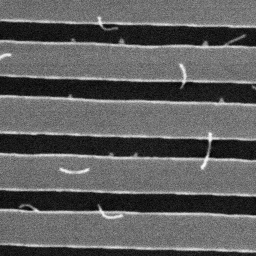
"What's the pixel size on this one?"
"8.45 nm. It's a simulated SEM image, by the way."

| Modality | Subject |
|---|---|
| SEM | lines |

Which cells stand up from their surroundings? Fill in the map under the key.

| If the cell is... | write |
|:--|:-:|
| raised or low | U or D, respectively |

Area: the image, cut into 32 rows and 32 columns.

UUUUUUUUUUUUUUUUUUUUUUUUUUUUUUUU
UUUUUUUUUUUUUUUUUUUUUUUUUUUUUUUU
UUUUUUUUUUUUUUUUUUUUUUUUUUUUUUUU
DDDDDDDDDDDDDDDDDDDDDDDDDDDDDDDD
DDDDDDDDDDDDDDDDDDDDDDDDDDDDDDDD
UUUUUUUUUUUUUUDDDDDDDDDDDDDDDDDD
UUUUUUUUUUUUUUUUUUUUUUUUUUUUUUUU
UUUUUUUUUUUUUUUUUUUUUUUUUUUUUUUU
UUUUUUUUUUUUUUUUUUUUUUUUUUUUUUUU
DUUUUUUUUUUUUUUUUUUUUUUUUUUUUUUU
DDDDDDDDDDDDDDDDDDDDDDDDDDDDDDDD
DDDDDDDDDDDDDDDDDDDDDDDDDDDDDDDD
UUUUUUUUUUUUDDDDDDDDDDDDDDDDDDDD
UUUUUUUUUUUUUUUUUUUUUUUUUUUUUUUU
UUUUUUUUUUUUUUUUUUUUUUUUUUUUUUUU
UUUUUUUUUUUUUUUUUUUUUUUUUUUUUUUU
UUUUUUUUUUUUUUUUUUUUUUUUUUUUUUUU
DDDDDDDDDDDDDDDDDDDDDDDDDDUDDDDD
DDDDDDDDDDDDDDDDDDDDDDDDDDDDDDDD
UUUUUUUUUUUUDDDDDDDDDDDDDDDDDDDD
UUUUUUUUUUUUUUUUUUUUUUUUUUUUUUUU
UUUUUUUUUUUUUUUUUUUUUUUUUUUUUUUU
UUUUUUUUUUUUUUUUUUUUUUUUUUUUUUUU
UUUUUUUUUUUUUUUUUUUUUUUUUUUUUUUU
DDDDDDDDDDDDDDDDDDDDDDDDDDDDDDDD
DDDDDDDDDDDDDDDDDDDDDDDDDDDDDDDD
UUUUUUUUUDUUUUUDDDDDDDDDDDDDDDDD
UUUUUUUUUUUUUUUUUUUUUUUUUUUUUUUU
UUUUUUUUUUUUUUUUUUUUUUUUUUUUUUUU
UUUUUUUUUUUUUUUUUUUUUUUUUUUUUUUU
UUUUUUUUUUUUUUUUUUUUUUUUUUUUUUUU
DDDDDDDDDDDDDDDDDDDDDDDDDDDDDDDD